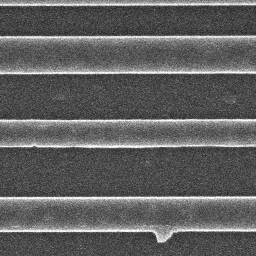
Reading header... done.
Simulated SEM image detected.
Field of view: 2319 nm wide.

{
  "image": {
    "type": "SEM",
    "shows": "one or a few lines or trenches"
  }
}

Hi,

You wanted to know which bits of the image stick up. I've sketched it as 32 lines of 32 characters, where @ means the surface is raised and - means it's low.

@@@@@@@@@@@@@@@@@@@@@@----------
--------------------------------
--------------------------------
--------------------------------
--------------------------------
@@@@@@@@@@@@@@@@@@@@@@@@@@@@@@@@
@@@@@@@@@@@@@@@@@@@@@@@@@@@@@@@@
@@@@@@@@@@@@@@@@@@@@@@@@@@@@@@@@
@@@@@@@@@@@@@@@@@@@@@@@@@@@@@@@@
--------------------------------
--------------------------------
--------------------------------
--------------------------------
--------------------------------
--------------------------------
@@@@@@@@@@@@@@@@@@@@@@@@@@@@@@@@
@@@@@@@@@@@@@@@@@@@@@@@@@@@@@@@@
@@@@@@@@@@@@@@@@@@@@@@@@@@@@@@@@
--------------------------------
--------------------------------
--------------------------------
--------------------------------
--------------------------------
--------------------------------
--------------------------------
@@@@@@@@@@@@@@@@@@@@@@@@@@@@@@@@
@@@@@@@@@@@@@@@@@@@@@@@@@@@@@@@@
@@@@@@@@@@@@@@@@@@@@@@@@@@@@@@@@
@@@@@@@@@@@@@@@@@@@@@@@@@@@@@@@@
--------------------@-----------
--------------------------------
--------------------------------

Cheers